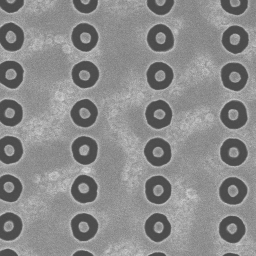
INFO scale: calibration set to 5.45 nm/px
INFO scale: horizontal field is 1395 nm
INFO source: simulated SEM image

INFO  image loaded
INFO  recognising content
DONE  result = a regular array of ring-shaped grooves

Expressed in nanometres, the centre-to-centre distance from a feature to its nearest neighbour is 204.